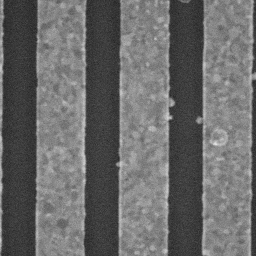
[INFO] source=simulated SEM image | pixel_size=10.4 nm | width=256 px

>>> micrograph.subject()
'lines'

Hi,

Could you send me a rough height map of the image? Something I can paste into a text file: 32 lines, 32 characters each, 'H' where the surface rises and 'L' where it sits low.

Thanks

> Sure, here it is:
LLLLLHHHHHHLLLLHHHHHHLLLLLHHHHHH
LLLLLHHHHHHLLLLHHHHHHLLLLLHHHHHH
LLLLLHHHHHHLLLLHHHHHHLLLLLHHHHHL
LLLLLHHHHHHLLLLHHHHHHLLLLLHHHHHL
LLLLLHHHHHHLLLLHHHHHHLLLLLHHHHHH
LLLLLHHHHHHLLLLHHHHHHLLLLLHHHHHH
LLLLLHHHHHLLLLLHHHHHHLLLLLHHHHHL
LLLLLHHHHHHLLLLHHHHHHLLLLLHHHHHH
LLLLLHHHHHHLLLLHHHHHHLLLLLHHHHHL
LLLLLHHHHHLLLLLHHHHHHLLLLLHHHHHL
LLLLLHHHHHHLLLLHHHHHHLLLLHHHHHHL
LLLLLHHHHHHLLLLHHHHHHLLLLLHHHHHL
LLLLLHHHHHLLLLLHHHHHHLLLLLHHHHHL
LLLLLHHHHHLLLLLHHHHHHLLLLLHHHHHL
LLLLLHHHHHLLLLLHHHHHHLLLLHHHHHHL
LLLLLHHHHHLLLLLHHHHHHLLLLHHHHHHL
LLLLLHHHHHLLLLLHHHHHHLLLLHHHHHHL
LLLLLHHHHHLLLLLHHHHHHLLLLHHHHHHL
LLLLLHHHHHLLLLLHHHHHHLLLLHHHHHHL
LLLLLHHHHHHLLLLHHHHHHLLLLHHHHHHL
LLLLLHHHHHHLLLLHHHHHHLLLLHHHHHHL
LLLLLHHHHHHLLLLHHHHHHLLLLHHHHHHL
LLLLLHHHHHHLLLLHHHHHHLLLLHHHHHHL
LLLLLHHHHHLLLLLHHHHHHLLLLHHHHHHL
LLLLLHHHHHLLLLLHHHHHHLLLLHHHHHHL
LLLLLHHHHHLLLLLHHHHHHLLLLHHHHHHL
LLLLLHHHHHLLLLLHHHHHHLLLLHHHHHHL
LLLLLHHHHHLLLLLHHHHHHLLLLHHHHHHL
LLLLLHHHHHLLLLLHHHHHHLLLLHHHHHHL
LLLLLHHHHHLLLLLHHHHHHLLLLHHHHHHL
LLLLLHHHHHLLLLLHHHHHHLLLLHHHHHHL
LLLLLHHHHHLLLLLHHHHHHLLLLHHHHHHL